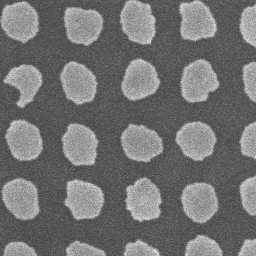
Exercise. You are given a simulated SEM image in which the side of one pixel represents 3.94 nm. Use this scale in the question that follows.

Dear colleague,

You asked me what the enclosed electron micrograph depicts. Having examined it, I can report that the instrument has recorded a regular array of raised bodies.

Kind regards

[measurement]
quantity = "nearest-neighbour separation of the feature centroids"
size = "221 nm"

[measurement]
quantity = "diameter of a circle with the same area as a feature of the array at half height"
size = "0.148 micrometres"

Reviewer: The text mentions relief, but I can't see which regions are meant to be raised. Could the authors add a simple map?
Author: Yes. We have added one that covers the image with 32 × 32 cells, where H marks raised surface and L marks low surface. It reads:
LLHLLLLLLLLLLLLLHHLLLLLHHLLLLLLL
HHHHLLLLHHHHLLLHHHHLLLLHHHLLLLHH
HHHHHLLLHHHHHLLHHHHLLLLHHHHLLLHH
HHHHHLLLHHHHHLLHHHHLLLLHHHHLLLHH
LHHHLLLLHHHHLLLLHHHLLLLHHHLLLLHH
LLLLLLLLLLLLLLLLLLLLLLLLLLLLLLLH
LLLLLLLLLLLLLLLLLLLLLLLLLLLLLLLL
LLLLLLLLLLLLLLLLLHLLLLLLLLLLLLLL
LLHHLLLLHHHLLLLLHHHLLLLHHHLLLLLH
LHHHHLLLHHHHLLLLHHHHLLLHHHHLLLHH
LHHHHLLLHHHHLLLHHHHHLLLHHHHLLLLH
LLLHHLLLHHHHLLLHHHHLLLLHHHLLLLLH
LLHHLLLLLHHLLLLLLLLLLLLHHLLLLLLL
LLLLLLLLLLLLLLLLLLLLLLLLLLLLLLLL
LLLLLLLLLLLLLLLLLLLLLLLLLLLLLLLL
LHHHLLLLLLLLLLLLLLLLLLLHHHLLLLLH
LHHHHLLLHHHHLLLLHHHLLLHHHHHLLLHH
LHHHHLLLHHHHLLLHHHHHLLHHHHHLLLHH
LHHHHLLLHHHHLLLHHHHHLLLHHHHLLLHH
LLHHHLLLHHHHLLLLHHHLLLLHHHLLLLLH
LLLLLLLLLHHLLLLLLLLLLLLLLLLLLLLL
LLLLLLLLLLLLLLLLLLLLLLLLLLLLLLLL
LLHLLLLLLLLLLLLLLHLLLLLLLLHLLLLH
HHHHLLLLHHHHLLLLHHHHLLLHHHHLLLHH
HHHHHLLLHHHHHLLLHHHHLLLHHHHLLLHH
LHHHHLLLHHHHHLLLHHHHLLLHHHHLLLHH
LHHHHLLLLHHHLLLLHHHHLLLHHHHLLLLH
LLLLLLLLLLLLLLLLLHLLLLLLHHLLLLLL
LLLLLLLLLLLLLLLLLLLLLLLLLLLLLLLL
LLLLLLLLLLLLLLLLLLLLLLLLLLLLLLLL
LHHLLLLLLHHLLLLLHHLLLLLLHHHLLLHH
LHHHLLLLHHHHHLLLHHHHLLLHHHHHLLHH